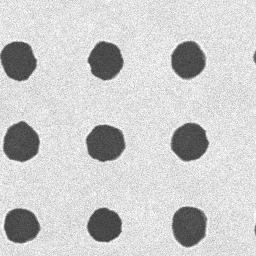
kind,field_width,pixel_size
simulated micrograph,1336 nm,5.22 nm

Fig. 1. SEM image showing a regular array of holes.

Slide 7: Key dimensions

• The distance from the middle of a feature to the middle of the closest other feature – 430 nm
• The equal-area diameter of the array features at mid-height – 0.196 microns